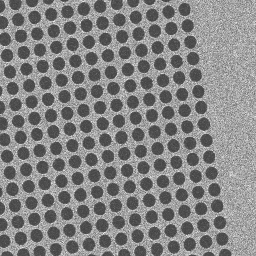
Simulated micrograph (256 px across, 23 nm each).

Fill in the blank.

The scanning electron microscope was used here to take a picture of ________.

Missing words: a regular array of holes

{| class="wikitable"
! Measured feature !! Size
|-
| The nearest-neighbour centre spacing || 377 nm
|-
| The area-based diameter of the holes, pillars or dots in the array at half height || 300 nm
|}